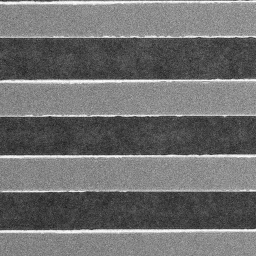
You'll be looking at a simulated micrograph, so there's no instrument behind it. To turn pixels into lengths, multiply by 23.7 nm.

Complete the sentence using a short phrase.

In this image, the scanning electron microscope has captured lines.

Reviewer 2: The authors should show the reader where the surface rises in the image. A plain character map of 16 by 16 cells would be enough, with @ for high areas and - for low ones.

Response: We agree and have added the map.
@@@@@@@@@@@@@@@@
@@@@@@@@@@@@@@@@
----------------
----------------
----------------
@@@@@@@@@@@@@@@@
@@@@@@@@@@@@@@@@
----------------
----------------
----------------
@@@@@@@@@@@@@@@@
@@@@@@@@@@@@@@@@
----------------
----------------
@@@@@@@@@@@@@@@@
@@@@@@@@@@@@@@@@